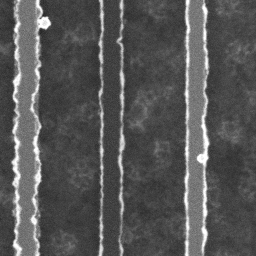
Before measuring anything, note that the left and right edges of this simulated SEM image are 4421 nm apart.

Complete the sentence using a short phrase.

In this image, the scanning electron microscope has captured one or a few lines or trenches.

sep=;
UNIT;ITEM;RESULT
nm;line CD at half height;348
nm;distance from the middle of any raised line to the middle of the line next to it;1460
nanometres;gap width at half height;1120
